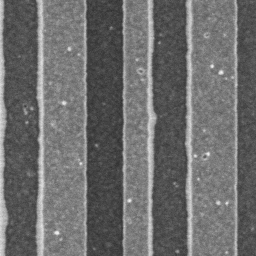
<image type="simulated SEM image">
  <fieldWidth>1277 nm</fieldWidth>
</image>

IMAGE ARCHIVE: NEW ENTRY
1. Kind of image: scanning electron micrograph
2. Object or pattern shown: lines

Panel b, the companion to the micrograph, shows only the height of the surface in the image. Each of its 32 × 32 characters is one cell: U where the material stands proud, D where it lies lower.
DDDDDUUUUUUDDDDUUUUDDDDDUUUUUDDD
DDDDDUUUUUUDDDDUUUUDDDDDUUUUUDDD
DDDDDUUUUUUDDDDUUUUDDDDDUUUUUDDD
DDDDDUUUUUUDDDDUUUUDDDDDUUUUUUDD
DDDDDUUUUUUDDDDUUUUDDDDDUUUUUDDD
DDDDDUUUUUUDDDDUUUUDDDDDUUUUUDDD
DDDDDUUUUUUDDDDUUUUDDDDDUUUUUDDD
DDDDDUUUUUUDDDDDUUUDDDDDUUUUUDDD
DDDDDUUUUUUDDDDUUUUDDDDDUUUUUUDD
DDDDDUUUUUUDDDDUUUUDDDDDUUUUUDDD
DDDDDUUUUUUDDDDUUUUDDDDDUUUUUUDD
DDDDDUUUUUUDDDDUUUUDDDDDUUUUUDDD
DDDDDUUUUUUDDDDUUUUDDDDDUUUUUDDD
DDDDDUUUUUUDDDDUUUUDDDDDUUUUUDDD
DDDDDUUUUUUDDDDUUUUDDDDDUUUUUDDD
DDDDDUUUUUUDDDDDUUUDDDDDUUUUUUDD
DDDDDUUUUUUDDDDUUUUDDDDDUUUUUDDD
DDDDDUUUUUUDDDDUUUUDDDDUUUUUUUDD
DDDDDUUUUUUDDDDUUUUDDDDDUUUUUUDD
DDDDDUUUUUUDDDDUUUUDDDDDUUUUUDDD
DDDDDUUUUUUDDDDUUUUDDDDDUUUUUDDD
DDDDDUUUUUUDDDDUUUUDDDDDUUUUUDDD
DDDDDUUUUUUDDDDUUUUDDDDDUUUUUDDD
DDDDDUUUUUUDDDDUUUUDDDDDUUUUUDDD
DDDDDUUUUUUDDDDDUUUDDDDDUUUUUUDD
DDDDDUUUUUUDDDDDUUUDDDDDUUUUUUDD
DDDDDUUUUUUDDDDUUUUDDDDDUUUUUDDD
DDDDDUUUUUUDDDDUUUUDDDDDUUUUUDDD
DDDDDUUUUUUDDDDUUUUDDDDDUUUUUUDD
DDDDDUUUUUUDDDDUUUUDDDDDUUUUUDDD
DDDDDUUUUUUDDDDUUUUDDDDDUUUUUUDD
DDDDDUUUUUUDDDDDUUUDDDDDUUUUUUDD